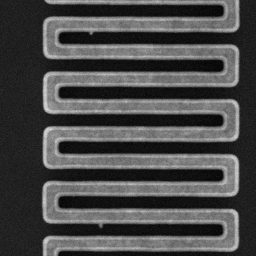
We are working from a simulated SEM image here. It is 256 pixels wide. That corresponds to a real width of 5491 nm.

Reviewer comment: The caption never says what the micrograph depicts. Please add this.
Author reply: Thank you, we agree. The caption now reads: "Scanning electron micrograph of groups of lines, slits or small figures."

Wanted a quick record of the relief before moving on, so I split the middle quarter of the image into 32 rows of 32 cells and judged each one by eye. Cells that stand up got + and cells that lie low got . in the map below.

................................
................................
++++++++++++++++++++++++++++++++
++++++++++++++++++++++++++++++++
++++++++++++++++++++++++++++++++
................................
................................
................................
................................
++++++++++++++++++++++++++++++++
++++++++++++++++++++++++++++++++
++++++++++++++++++++++++++++++++
................................
................................
................................
................................
++++++++++++++++++++++++++++++++
++++++++++++++++++++++++++++++++
++++++++++++++++++++++++++++++++
................................
................................
................................
................................
++++++++++++++++++++++++++++++++
++++++++++++++++++++++++++++++++
++++++++++++++++++++++++++++++++
................................
................................
................................
................................
++++++++++++++++++++++++++++++++
++++++++++++++++++++++++++++++++